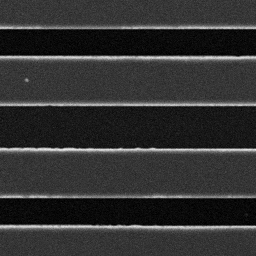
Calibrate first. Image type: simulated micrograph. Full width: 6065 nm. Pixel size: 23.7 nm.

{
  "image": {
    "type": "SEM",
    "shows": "lines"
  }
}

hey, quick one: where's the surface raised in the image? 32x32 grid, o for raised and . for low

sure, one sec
oooooooooooooooooooooooooooooooo
oooooooooooooooooooooooooooooooo
oooooooooooooooooooooooooooooooo
oooooooooooooooooooooooooooooooo
................................
................................
................................
oooooooooooooooooooooooooooooooo
oooooooooooooooooooooooooooooooo
oooooooooooooooooooooooooooooooo
oooooooooooooooooooooooooooooooo
oooooooooooooooooooooooooooooooo
oooooooooooooooooooooooooooooooo
................................
................................
................................
................................
................................
................................
oooooooooooooooooooooooooooooooo
oooooooooooooooooooooooooooooooo
oooooooooooooooooooooooooooooooo
oooooooooooooooooooooooooooooooo
oooooooooooooooooooooooooooooooo
oooooooooooooooooooooooooooooooo
................................
................................
................................
oooooooooooooooooooooooooooooooo
oooooooooooooooooooooooooooooooo
oooooooooooooooooooooooooooooooo
oooooooooooooooooooooooooooooooo